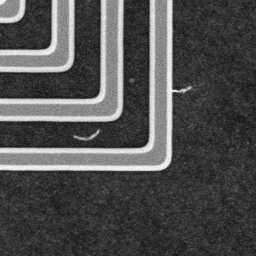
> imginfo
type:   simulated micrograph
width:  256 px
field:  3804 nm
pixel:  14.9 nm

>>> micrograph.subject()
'groups of lines, slits or small figures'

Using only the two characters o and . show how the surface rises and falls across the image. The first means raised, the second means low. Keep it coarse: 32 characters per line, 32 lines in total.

ooo....oo....oo....oo...........
ooo....oo....oo....oo...........
oo.....oo....oo....oo...........
.......oo....oo....oo...........
.......oo....oo....oo...........
.......oo....oo....oo...........
.....oooo....oo....oo...........
ooooooooo....oo....oo...........
oooooooo.....oo....oo...........
.............oo....oo...........
.............oo....oo...........
.............oo....oo...........
............ooo....oo...........
ooooooooooooooo....oo...........
ooooooooooooooo....oo...........
...................oo...........
...................oo...........
...................oo...........
..................ooo...........
ooooooooooooooooooooo...........
ooooooooooooooooooooo...........
................................
................................
................................
................................
................................
................................
................................
................................
................................
................................
................................